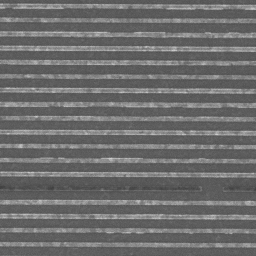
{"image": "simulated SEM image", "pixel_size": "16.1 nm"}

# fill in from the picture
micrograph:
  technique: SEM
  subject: parallel lines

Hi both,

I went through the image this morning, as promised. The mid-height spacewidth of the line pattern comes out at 165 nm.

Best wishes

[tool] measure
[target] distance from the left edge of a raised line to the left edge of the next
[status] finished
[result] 226 nm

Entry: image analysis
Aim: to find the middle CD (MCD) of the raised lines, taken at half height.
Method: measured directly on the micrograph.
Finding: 64.6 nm